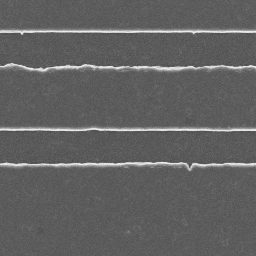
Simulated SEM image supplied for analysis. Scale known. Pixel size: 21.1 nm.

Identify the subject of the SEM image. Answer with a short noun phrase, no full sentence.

one or a few lines or trenches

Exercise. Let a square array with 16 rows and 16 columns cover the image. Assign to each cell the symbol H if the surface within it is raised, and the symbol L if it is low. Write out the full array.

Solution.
HHHHHHHHHHHHHHHH
HHHHHHHHHHHHHHHH
LLLLLLLLLLLLLLLL
LLLLLLLLLLLLLLLL
HHHHHHHHHHHHHHHH
HHHHHHHHHHHHHHHH
HHHHHHHHHHHHHHHH
HHHHHHHHHHHHHHHH
LLLLLLLLLLLLLLLL
LLLLLLLLLLLLLLLL
HHHHHHHHHHHHHHHH
HHHHHHHHHHHHHHHH
HHHHHHHHHHHHHHHH
HHHHHHHHHHHHHHHH
HHHHHHHHHHHHHHHH
HHHHHHHHHHHHHHHH